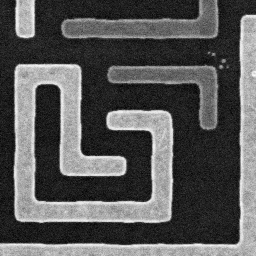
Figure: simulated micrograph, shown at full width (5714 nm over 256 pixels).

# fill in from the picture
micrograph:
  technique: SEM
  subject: wiring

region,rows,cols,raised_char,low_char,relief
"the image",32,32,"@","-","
--@@---------------------@@-----
--@@---------------------@@-----
--@@--------------------@@@---@@
--@@----@@@@@@@@@@@@@@@@@@@---@@
---@----@@@@@@@@@@@@@@@@@@@---@@
------------------------------@@
------------------------------@@
------------------------------@@
--@@@@@@@@----@@@@@@@@@@@@----@@
--@@@@@@@@----@@@@@@@@@@@@@---@@
--@@@--@@@---------------@@---@@
--@@----@@---------------@@---@@
--@@----@@---------------@@---@@
--@@----@@---------------@@---@@
--@@----@@----@@@@@@@----@@---@@
--@@----@@----@@@@@@@----@@---@@
--@@----@@---------@@---------@@
--@@----@@---------@@---------@@
--@@----@@---------@@---------@@
--@@----@@@--------@@---------@@
--@@----@@@@@@@@---@@---------@@
--@@----@@@@@@@----@@---------@@
--@@---------------@@---------@@
--@@---------------@@---------@@
--@@---------------@@---------@@
--@@@@@@@@@@@@@@@@@@@---------@@
--@@@@@@@@@@@@@@@@@@@---------@@
---@@@@@@@@@@@@@@@@@@---------@@
------------------------------@@
------------------------------@@
------------------------------@@
@@@@@@@@@@@@@@@@@@@@@@@@@@@@@@@@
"